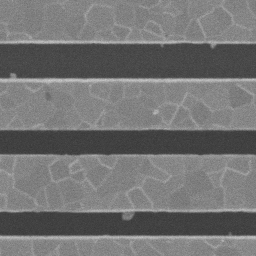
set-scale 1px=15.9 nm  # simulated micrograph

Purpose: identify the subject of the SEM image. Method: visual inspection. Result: lines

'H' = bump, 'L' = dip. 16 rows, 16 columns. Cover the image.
HHHHHHHHHHHHHHHH
HHHHHHHHHHHHHHHH
HHHHHHHHHHHHHHHH
LLLLLLLLLLLLLLLL
LLLLLLLLLLLLLLLL
HHHHHHHHHHHHHHHH
HHHHHHHHHHHHHHHH
HHHHHHHHHHHHHHHH
LLLLLLLLLLLLLLLL
LLLLLLLLLLLLLLLL
HHHHHHHHHHHHHHHH
HHHHHHHHHHHHHHHH
HHHHHHHHHHHHHHHH
LLLLLLLLLLLLLLLL
LLLLLLLLLLLLLLLL
HHHHHHHHHHHHHHHH